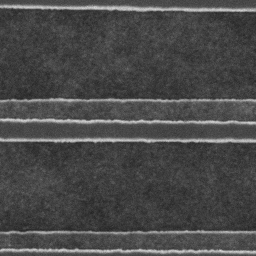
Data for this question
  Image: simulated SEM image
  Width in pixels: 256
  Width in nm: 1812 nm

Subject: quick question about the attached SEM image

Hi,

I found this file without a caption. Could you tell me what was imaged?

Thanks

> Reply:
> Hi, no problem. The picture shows lines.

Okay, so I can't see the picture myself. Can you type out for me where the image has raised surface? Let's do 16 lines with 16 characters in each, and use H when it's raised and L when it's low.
LHHHHHHHHHHHHHHH
LLLLLLLLLLLLLLLL
LLLLLLLLLLLLLLLL
LLLLLLLLLLLLLLLL
LLLLLLLLLLLLLLLL
LLLLLLLLLLLLLLLL
HHHHHHHHHHHHHHHH
HHHHHHHHHHHHHHHH
HHHHHHHHHHHHHHHH
LLLLLLLLLLLLLLLL
LLLLLLLLLLLLLLLL
LLLLLLLLLLLLLLLL
LLLLLLLLLLLLLLLL
LLLLLLLLLLLLLLLL
LLLLLLLLLLLHHHHH
HHHHHHHHHHHHHHHH